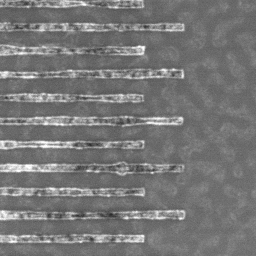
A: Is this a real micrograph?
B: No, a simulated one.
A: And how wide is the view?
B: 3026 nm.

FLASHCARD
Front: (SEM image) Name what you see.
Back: parallel lines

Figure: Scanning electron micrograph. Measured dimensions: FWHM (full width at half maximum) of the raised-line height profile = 6.38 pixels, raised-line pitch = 0.278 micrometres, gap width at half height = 205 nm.